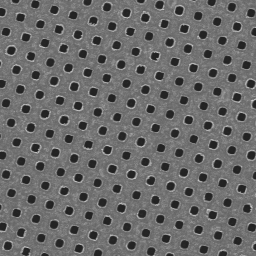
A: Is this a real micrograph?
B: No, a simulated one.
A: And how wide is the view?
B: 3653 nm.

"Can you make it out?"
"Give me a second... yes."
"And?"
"a regular array of holes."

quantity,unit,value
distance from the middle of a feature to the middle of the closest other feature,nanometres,275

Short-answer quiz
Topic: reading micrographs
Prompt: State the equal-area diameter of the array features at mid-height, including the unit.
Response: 122 nm